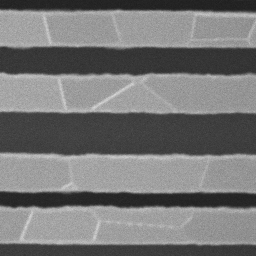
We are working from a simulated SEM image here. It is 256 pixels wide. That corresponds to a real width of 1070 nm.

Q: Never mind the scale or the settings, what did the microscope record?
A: lines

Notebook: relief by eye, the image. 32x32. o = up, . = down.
................................
ooooooooooooooooooooooooooo.....
oooooooooooooooooooooooooooooooo
oooooooooooooooooooooooooooooooo
oooooooooooooooooooooooooooooooo
oooooooooooooooooooooooooooooooo
................................
................................
................................
oooooooooooooooooooooooooooooooo
oooooooooooooooooooooooooooooooo
oooooooooooooooooooooooooooooooo
oooooooooooooooooooooooooooooooo
oooooooooooooooooooooooooooooooo
................................
................................
................................
................................
................................
ooooooo...oo.................o..
oooooooooooooooooooooooooooooooo
oooooooooooooooooooooooooooooooo
oooooooooooooooooooooooooooooooo
oooooooooooooooooooooooooooooooo
................................
................................
oooooooooooooooooooooooooooooooo
oooooooooooooooooooooooooooooooo
oooooooooooooooooooooooooooooooo
oooooooooooooooooooooooooooooooo
................................
................................